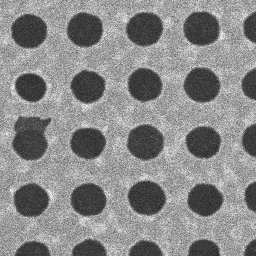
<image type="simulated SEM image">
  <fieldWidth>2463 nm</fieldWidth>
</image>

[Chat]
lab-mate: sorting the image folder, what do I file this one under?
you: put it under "a regular array of holes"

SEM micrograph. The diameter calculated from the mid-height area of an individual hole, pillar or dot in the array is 337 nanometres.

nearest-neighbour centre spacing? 541 nanometres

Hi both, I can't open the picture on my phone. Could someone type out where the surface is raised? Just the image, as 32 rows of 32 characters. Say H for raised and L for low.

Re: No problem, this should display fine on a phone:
HHHHHHHHHHHHHHHHHHHHHHHHHHHHHHHH
HHHHHHHHHHHHHHHHHHHHHHHHLLHHHHHH
HHLLLHHHHLLLLHHHLLLLHHHLLLLHHHHL
HLLLLLHHLLLLLHHHLLLLHHHLLLLHHHLL
HLLLLLHHLLLLLHHHLLLLHHHLLLLHHHHL
HHLLLHHHHLLLHHHHHLLHHHHHLLHHHHHH
HHHHHHHHHHHHHHHHHHHHHHHHHHHHHHHH
HHHHHHHHHHHHHHHHHHHHHHHHHHHHHHHH
HHHHHHHHHHHHHHHHHHHHHHHHLLHHHHHH
HHHLLHHHHLLLLHHHLLLLHHHLLLLHHHHL
HHLLLLHHHLLLLHHHLLLLHHHLLLLLHHLL
HHLLLLHHHLLLLHHHLLLLHHHLLLLHHHLL
HHHLLHHHHHLLHHHHHLLHHHHHLLLHHHHH
HHHHHHHHHHHHHHHHHHHHHHHHHHHHHHHH
HHHHLHHHHHHHHHHHHHHHHHHHHHHHHHHH
HHLLLLHHHHHHHHHHHHHHHHHHHHHHHHHH
HHLLLLHHHLLLLHHHLLLLHHHHLLLHHHLL
HHLLLLHHHLLLLHHHLLLLHHHLLLLLHHLL
HHLLLLHHHLLLLHHHLLLLHHHLLLLHHHHL
HHLLLHHHHHLLHHHHHLLLHHHHLLLHHHHH
HHHHHHHHHHHHHHHHHHHHHHHHHHHHHHHH
HHHHHHHHHHHHHHHHHHHHHHHHHHHHHHHH
HHHHHHHHHHHHHHHHHHHHHHHHHHHHHHHH
HHLLLHHHHLLLLHHHLLLLHHHHLLLHHHHL
HHLLLLHHHLLLLHHHLLLLLHHLLLLLHHHL
HHLLLLHHHLLLLHHHLLLLLHHLLLLLHHHL
HHLLLHHHHHLLLHHHHLLLHHHHLLLHHHHH
HHHHHHHHHHHHHHHHHHHHHHHHHHHHHHHH
HHHHHHHHHHHHHHHHHHHHHHHHHHHHHHHH
HHHHHHHHHHHHHHHHHHHHHHHHHHHHHHHH
HHHLLHHHHHLLLHHHHLLHHHHHLLLHHHHL
HHLLLLHHHLLLLHHHLLLLHHHHLLLHHHHL